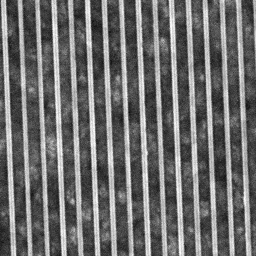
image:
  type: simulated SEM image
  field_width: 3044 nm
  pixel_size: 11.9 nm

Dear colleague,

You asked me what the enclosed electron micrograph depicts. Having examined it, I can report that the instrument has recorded parallel lines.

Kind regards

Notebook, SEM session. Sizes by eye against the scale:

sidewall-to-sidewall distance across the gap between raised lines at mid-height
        159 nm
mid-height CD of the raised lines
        46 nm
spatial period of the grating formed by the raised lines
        199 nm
